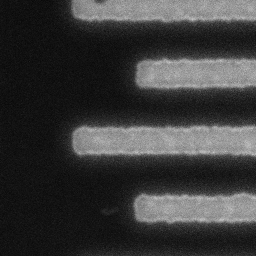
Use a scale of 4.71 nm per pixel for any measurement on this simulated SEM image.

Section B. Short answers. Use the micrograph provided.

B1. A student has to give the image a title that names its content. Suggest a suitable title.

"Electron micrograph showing one or a few lines or trenches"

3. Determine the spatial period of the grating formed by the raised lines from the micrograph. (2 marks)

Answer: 318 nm